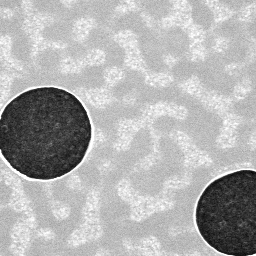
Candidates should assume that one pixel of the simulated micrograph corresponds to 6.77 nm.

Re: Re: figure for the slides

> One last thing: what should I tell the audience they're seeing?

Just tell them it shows holes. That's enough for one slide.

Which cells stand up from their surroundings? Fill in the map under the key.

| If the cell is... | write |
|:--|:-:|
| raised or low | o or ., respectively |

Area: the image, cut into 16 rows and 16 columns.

oooooooooooooooo
oooooooooooooooo
oooooooooooooooo
oooooooooooooooo
oooooooooooooooo
oo.ooooooooooooo
o....ooooooooooo
......oooooooooo
......oooooooooo
.....ooooooooooo
o....ooooooooooo
ooooooooooooo...
oooooooooooo....
oooooooooooo....
oooooooooooo....
ooooooooooooo...